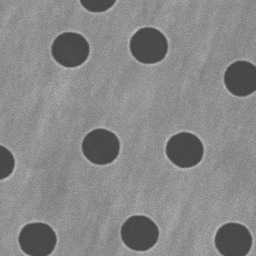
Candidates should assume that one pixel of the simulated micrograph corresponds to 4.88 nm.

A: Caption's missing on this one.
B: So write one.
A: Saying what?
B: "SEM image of holes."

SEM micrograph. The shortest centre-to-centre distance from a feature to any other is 406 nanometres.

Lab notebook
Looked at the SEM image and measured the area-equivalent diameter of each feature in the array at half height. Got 37.5 pixels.